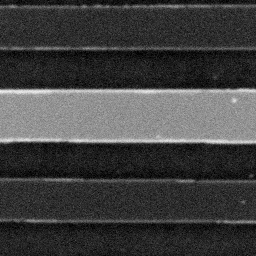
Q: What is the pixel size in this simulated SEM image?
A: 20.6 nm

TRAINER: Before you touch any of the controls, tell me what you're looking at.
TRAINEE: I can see lines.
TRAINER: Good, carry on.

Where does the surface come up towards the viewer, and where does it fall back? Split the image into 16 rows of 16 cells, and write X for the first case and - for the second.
XXXXXXXXXXXXXXXX
XXXXXXXXXXXXXXXX
XXXXXXXXXXXXXXXX
----------------
----------------
----------------
XXXXXXXXXXXXXXXX
XXXXXXXXXXXXXXXX
XXXXXXXXXXXXXXXX
----------------
----------------
XXXXXXXXXXXXXXXX
XXXXXXXXXXXXXXXX
XXXXXXXXXXXXXXXX
----------------
----------------